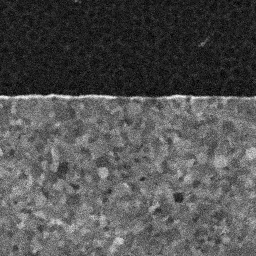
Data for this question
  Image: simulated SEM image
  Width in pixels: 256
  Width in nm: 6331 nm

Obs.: one or a few lines or trenches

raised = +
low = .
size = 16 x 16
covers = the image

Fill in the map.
................
................
................
................
................
................
++++++++++++++++
++++++++++++++++
++++++++++++++++
++++++++++++++++
++++++++++++++++
++++++++++++++++
++++++++++++++++
++++++++++++++++
++++++++++++++++
++++++++++++++++